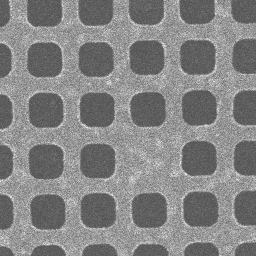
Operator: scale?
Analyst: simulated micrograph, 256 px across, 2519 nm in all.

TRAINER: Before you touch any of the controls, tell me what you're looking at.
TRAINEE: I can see a regular array of holes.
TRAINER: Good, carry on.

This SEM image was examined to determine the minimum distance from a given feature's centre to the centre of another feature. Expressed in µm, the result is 0.496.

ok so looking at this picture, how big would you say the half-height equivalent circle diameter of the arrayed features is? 368 nm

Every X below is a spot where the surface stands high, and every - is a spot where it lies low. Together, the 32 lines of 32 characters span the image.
-XX-----XX----XX----XX-----XX---
-XX-----XX----XX----XX-----XX---
-XX-----XX----XXX---XXX----XX---
XXXXXXXXXXXXXXXXXXXXXXXXXXXXXXXX
XXXXXXXXXXXXXXXXXXXXXXXXXXXXXXXX
-XXX---XXXX--XXXX---XXX----XX---
-XXX----XX----XX-----X-----XX---
-XX-----XX----XX-----XX----XX---
-XX-----XX----XX----XXX----XX---
-XXX---XXXX--XXXXXXXXXXXXXXXXXXX
XXXXXXXXXXXXXXXXXXXXXXXXXXXXXXXX
XXXXXXXXXXXX-XXXXXXXXXXX--XXXX--
-XXX----XX----XX-----XX----XX---
--XX----XX----XX-----XX----XX---
--XX----XX----XX-----XX----XX---
-XXX----XX----XXX---XXX---XXXX--
XXXXXXXXXXXXXXXXXXXXXXXXXXXXXXXX
XXXXXXXXXXXXXXXXXXXXXXXXXXXXXXXX
-XXX----XX----XXXXXXXXX----XX---
--XX----XX----XXXXXXXXX----XX---
--XX----XX----XXXXXXXXX----XX---
--XX----XX----XXXXXXXXX----XXX--
XXXXXXXXXXXXXXXXXXXXXXXXXXXXXXXX
XXXXXXXXXXXXXXXXXXXXXXXXXXXXXXXX
-XXXX--XXXX---XXX---XXX----XXX--
--XX----XX----XXX----XX----XX---
--XX----XX-----X-----XX----XX---
--XX----XX----XXX----XX----XXX--
-XXXX---XXXXXXXXXXXXXXXXXXXXXXXX
XXXXXXXXXXXXXXXXXXXXXXXXXXXXXXXX
XXXXXXXXXXXX-XXXXX-XXXXX---XXX--
--XX----XX-----XX----XX----XX---